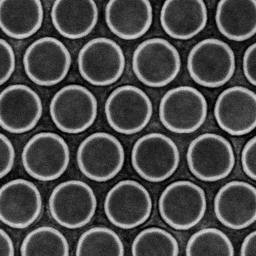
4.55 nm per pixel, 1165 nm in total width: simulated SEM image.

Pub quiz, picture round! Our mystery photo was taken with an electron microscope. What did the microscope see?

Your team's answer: a regular array of raised bodies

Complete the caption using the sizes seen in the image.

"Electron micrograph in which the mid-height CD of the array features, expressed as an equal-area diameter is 0.204 µm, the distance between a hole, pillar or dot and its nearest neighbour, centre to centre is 54.6 pixels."